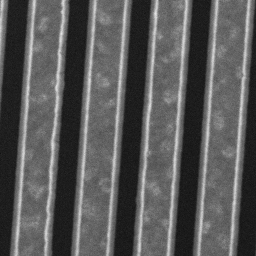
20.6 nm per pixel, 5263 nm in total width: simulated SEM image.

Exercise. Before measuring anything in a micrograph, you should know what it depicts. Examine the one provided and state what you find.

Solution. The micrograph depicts one or a few lines or trenches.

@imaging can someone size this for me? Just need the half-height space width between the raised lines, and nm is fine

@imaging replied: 548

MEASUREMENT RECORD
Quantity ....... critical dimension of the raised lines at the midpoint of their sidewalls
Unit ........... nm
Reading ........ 718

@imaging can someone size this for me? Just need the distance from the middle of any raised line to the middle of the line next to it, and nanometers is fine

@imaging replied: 1260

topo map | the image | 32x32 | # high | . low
....####....####...#####...####.
....####....####...####....####.
....####...#####...####....####.
....####...#####...####....####.
....####...#####...####....####.
....####...#####...####...#####.
....####...#####...####...#####.
...#####...####....####...#####.
...#####...####....####...#####.
...#####...####....####...#####.
...####....####....####...#####.
...####....####....####...#####.
...####....####....####...####..
...####....####...#####...####..
...####....####...#####...####..
...####....####...####....####..
...####...#####...####....####..
...####...#####...####....####..
...####...#####...####....####..
...####...#####...####...#####..
...####...####....####...#####..
..#####...####....####...#####..
..#####...####....####...#####..
..#####...####....####...#####..
..####....####....####...#####..
..####....####....####...#####..
..####....####...#####...####...
..####....####...#####...####...
..####....####...#####...####...
..####....####...####....####...
..####...#####...####....####...
..####...#####...####....####...